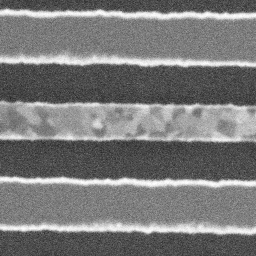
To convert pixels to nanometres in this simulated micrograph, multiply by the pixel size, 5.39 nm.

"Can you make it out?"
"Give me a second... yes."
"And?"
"lines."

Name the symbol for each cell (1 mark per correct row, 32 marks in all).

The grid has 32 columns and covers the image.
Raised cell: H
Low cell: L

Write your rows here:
LLLLLLLLLLLLLLLLLLLLLLLLLLLLLLLL
HHLLLLLLLLLLHLLLLLLLLLLLLLLLLLLL
HHHHHHHHHHHHHHHHHHHHHHHHHHHHHHHH
HHHHHHHHHHHHHHHHHHHHHHHHHHHHHHHH
HHHHHHHHHHHHHHHHHHHHHHHHHHHHHHHH
HHHHHHHHHHHHHHHHHHHHHHHHHHHHHHHH
HHHHHHHHHHHHHHHHHHHHHHHHHHHHHHHH
HHHHHHHHHHHHHHHHHHHHHHHHHHHHHHHH
LLLLLLLLLLLLLLLLLLLLLLLLLLLLLLLL
LLLLLLLLLLLLLLLLLLLLLLLLLLLLLLLL
LLLLLLLLLLLLLLLLLLLLLLLLLLLLLLLL
LLLLLLLLLLLLLLLLLLLLLLLLLLLLLLLL
LLLLLLLLLLLLLLLLLLLLLLLLLLLLLLLL
HHHHHHHHHHHHHHHHHHHHHHHHHHHHHHHH
HHHHHHHHHHHHHHHHHHHHHHHHHHHHHHHH
HHHHHHHHHHHHHHHHHHHHHHHHHHHHHHHH
HHHHHHHHHHHHHHHHHHHHHHHHHHHHHHHH
LLLLLLLLLLLLLLLLLLLLHHLHLHHHHHHH
LLLLLLLLLLLLLLLLLLLLLLLLLLLLLLLL
LLLLLLLLLLLLLLLLLLLLLLLLLLLLLLLL
LLLLLLLLLLLLLLLLLLLLLLLLLLLLLLLL
LLLLLLLLLLLLLLLLLLLLLLLLLLLLLLLL
HHHLHLHHLLLLLLLLLLLLLLLLLLLLLLLL
HHHHHHHHHHHHHHHHHHHHHHHHHHHHHHHH
HHHHHHHHHHHHHHHHHHHHHHHHHHHHHHHH
HHHHHHHHHHHHHHHHHHHHHHHHHHHHHHHH
HHHHHHHHHHHHHHHHHHHHHHHHHHHHHHHH
HHHHHHHHHHHHHHHHHHHHHHHHHHHHHHHH
HHHHHHHHHHHHHHHHHHHHHHHHHHHHHHHH
LLLLLLLLLLLLLLLLLLLLLLLLLLLLLLLL
LLLLLLLLLLLLLLLLLLLLLLLLLLLLLLLL
LLLLLLLLLLLLLLLLLLLLLLLLLLLLLLLL